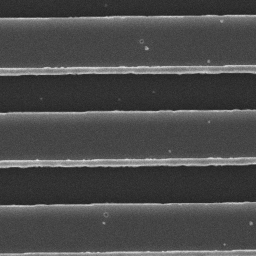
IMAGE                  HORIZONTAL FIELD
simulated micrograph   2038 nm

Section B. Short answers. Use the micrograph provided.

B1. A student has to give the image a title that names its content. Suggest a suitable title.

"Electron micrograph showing lines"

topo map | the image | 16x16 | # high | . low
................
################
################
################
################
................
................
################
################
################
................
................
................
################
################
################